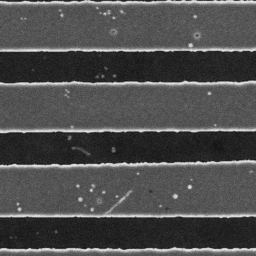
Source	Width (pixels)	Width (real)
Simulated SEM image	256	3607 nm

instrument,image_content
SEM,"lines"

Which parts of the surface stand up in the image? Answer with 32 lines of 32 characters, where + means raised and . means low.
++++++++++++++++++++++++++++++++
++++++++++++++++++++++++++++++++
++++++++++++++++++++++++++++++++
++++++++++++++++++++++++++++++++
++++++++++++++++++++++++++++++++
++++++++++++++++++++++++++++++++
................................
................................
................................
................................
++++++++++++++++++++++++++++++++
++++++++++++++++++++++++++++++++
++++++++++++++++++++++++++++++++
++++++++++++++++++++++++++++++++
++++++++++++++++++++++++++++++++
++++++++++++++++++++++++++++++++
+..+............................
................................
................................
................................
.............+++.+++++++++++++++
++++++++++++++++++++++++++++++++
++++++++++++++++++++++++++++++++
++++++++++++++++++++++++++++++++
++++++++++++++++++++++++++++++++
++++++++++++++++++++++++++++++++
++++++++++++++++++++++++++++++++
................................
................................
................................
................................
++++++++++++++++++++++++++++++++